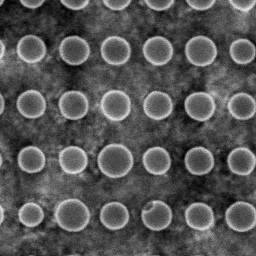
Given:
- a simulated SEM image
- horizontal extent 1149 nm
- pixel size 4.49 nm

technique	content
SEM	a regular array of raised bodies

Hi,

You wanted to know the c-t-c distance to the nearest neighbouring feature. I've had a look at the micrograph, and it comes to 41.4 pixels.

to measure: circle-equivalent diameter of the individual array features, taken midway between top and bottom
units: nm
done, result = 126